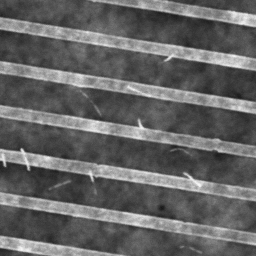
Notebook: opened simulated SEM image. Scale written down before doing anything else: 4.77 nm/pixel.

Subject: parallel lines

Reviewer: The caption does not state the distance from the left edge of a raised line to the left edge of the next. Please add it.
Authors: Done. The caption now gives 206 nm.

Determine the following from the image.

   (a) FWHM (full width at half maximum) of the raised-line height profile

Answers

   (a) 10.8 pixels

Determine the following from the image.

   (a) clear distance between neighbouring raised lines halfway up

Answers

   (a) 153 nm